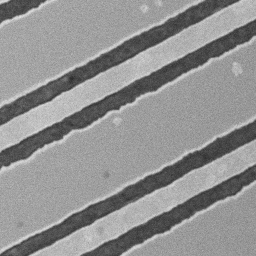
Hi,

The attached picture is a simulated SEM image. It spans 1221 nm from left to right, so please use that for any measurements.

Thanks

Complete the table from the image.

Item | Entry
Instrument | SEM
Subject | lines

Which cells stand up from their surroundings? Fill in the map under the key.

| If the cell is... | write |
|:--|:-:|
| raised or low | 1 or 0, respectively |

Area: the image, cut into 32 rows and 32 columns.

00000111111111111111111100000111
00011111111111111111111000011111
01111111111111111111100001111111
11111111111111111110000111111100
11111111111111111000001111110000
11111111111111100000111111000011
11111111111110000011111100001111
11111111111000001111110000111111
11111111100000111111000001111111
11111111000011111100000111111111
11111100001111110000011111111111
11110000111111000001111111111111
11000011111110000111111111111111
00001111110000011111111111111111
00111111000001111111111111111111
01111110000011111111111111111110
11111000011111111111111111111000
11100000111111111111111111100000
10000111111111111111111110000011
00001111111111111111111000001111
00111111111111111111110000111111
11111111111111111111000011111100
11111111111111111000001111110000
11111111111111100000111111000001
11111111111111000011111100000111
11111111111000001111110000011111
11111111110000111111100001111111
11111111000011111110000111111111
11111100001111111000001111111111
11110000111111100001111111111111
11000001111110000011111111111111
01100111111000001111111111111111